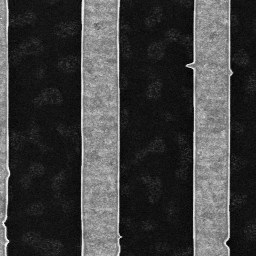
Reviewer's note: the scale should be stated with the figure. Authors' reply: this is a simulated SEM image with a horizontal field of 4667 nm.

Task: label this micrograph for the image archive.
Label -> one or a few lines or trenches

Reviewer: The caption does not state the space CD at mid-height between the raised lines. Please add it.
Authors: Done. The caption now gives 1370 nanometers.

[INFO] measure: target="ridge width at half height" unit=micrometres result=0.645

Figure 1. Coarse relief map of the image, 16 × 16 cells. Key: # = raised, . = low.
.....##.....##..
.....##.....##..
.....##.....##..
.....##.....##..
.....##.....##..
.....##.....##..
.....##.....##..
.....##.....##..
.....##.....##..
.....##.....##..
#....##.....##..
.....##.....##..
.....##.....##..
.....##.....##..
.....##.....##..
.....##.....##..